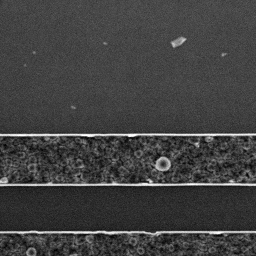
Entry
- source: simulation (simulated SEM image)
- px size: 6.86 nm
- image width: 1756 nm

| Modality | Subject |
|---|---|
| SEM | one or a few lines or trenches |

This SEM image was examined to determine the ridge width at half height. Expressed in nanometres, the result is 352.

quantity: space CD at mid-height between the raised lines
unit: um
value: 0.316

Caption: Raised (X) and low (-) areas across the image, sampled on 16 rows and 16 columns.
----------------
----------------
----------------
----------------
----------------
----------------
----------------
----------------
XXXXXXXXXXXXXXXX
XXXXXXXXXXXXXXXX
XXXXXXXXXXXXXXXX
XXXXXXXXXXXXXXXX
----------------
----------------
-XX---X-----XXXX
XXXXXXXXXXXXXXXX